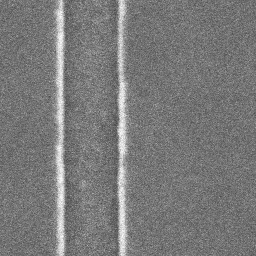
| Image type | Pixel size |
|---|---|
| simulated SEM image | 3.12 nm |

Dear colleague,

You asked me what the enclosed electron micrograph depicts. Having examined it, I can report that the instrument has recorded one or a few lines or trenches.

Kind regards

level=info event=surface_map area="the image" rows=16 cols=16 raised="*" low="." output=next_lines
****....********
****....********
****...*********
****...*********
****....********
****...*********
****...*********
****...*********
****...*********
****....********
****....********
****....********
****....********
****....********
****....********
****....********